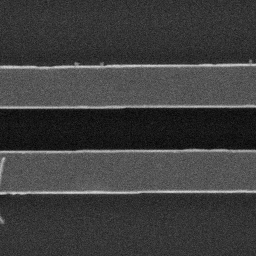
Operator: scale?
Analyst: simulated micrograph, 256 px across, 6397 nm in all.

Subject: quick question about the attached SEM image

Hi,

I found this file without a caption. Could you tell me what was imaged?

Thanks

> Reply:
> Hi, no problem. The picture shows lines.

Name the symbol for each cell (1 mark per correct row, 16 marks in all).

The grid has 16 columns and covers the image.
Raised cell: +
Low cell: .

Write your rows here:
................
................
................
................
++++++++++++++++
++++++++++++++++
++++++++++++++++
................
................
++++++++++++++++
++++++++++++++++
++++++++++++++++
................
................
................
................